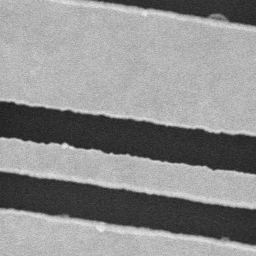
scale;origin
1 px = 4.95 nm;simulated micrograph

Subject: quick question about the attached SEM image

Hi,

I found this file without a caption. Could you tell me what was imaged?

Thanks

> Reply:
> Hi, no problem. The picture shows lines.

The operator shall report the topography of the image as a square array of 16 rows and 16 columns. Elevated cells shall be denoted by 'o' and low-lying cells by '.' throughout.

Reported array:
oooooooo........
ooooooooooooooo.
oooooooooooooooo
oooooooooooooooo
oooooooooooooooo
oooooooooooooooo
.ooooooooooooooo
.........ooooooo
................
oooooo..........
ooooooooooooo...
......oooooooooo
............oooo
ooo.............
oooooooooo......
oooooooooooooooo